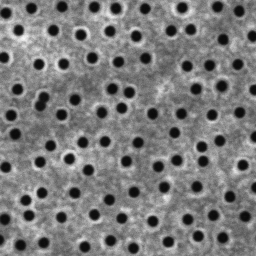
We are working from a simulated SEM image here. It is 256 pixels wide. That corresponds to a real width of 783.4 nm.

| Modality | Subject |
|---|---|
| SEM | a regular array of holes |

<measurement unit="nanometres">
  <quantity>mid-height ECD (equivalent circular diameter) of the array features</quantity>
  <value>32.9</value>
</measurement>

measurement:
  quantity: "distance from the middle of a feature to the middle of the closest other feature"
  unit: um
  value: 0.0688